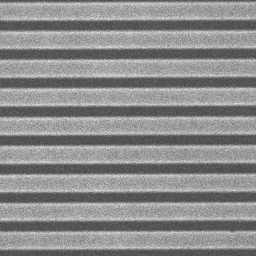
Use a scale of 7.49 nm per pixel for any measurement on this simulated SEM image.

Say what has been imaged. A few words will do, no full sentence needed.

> parallel lines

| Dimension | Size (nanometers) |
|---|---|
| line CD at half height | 132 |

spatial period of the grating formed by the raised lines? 214 nm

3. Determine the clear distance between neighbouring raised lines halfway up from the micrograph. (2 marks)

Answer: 81.4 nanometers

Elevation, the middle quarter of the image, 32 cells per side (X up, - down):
XXXXXXXXXXXXXXXXXXXXXXXXXXXXXXXX
XXXXXXXXXXXXXXXXXXXXXXXXXXXXXXXX
XXXXXXXXXXXXXXXXXXXXXXXXXXXXXXXX
--------------------------------
--------------------------------
--------------------------------
XXXXXXXXXXXXXXXXXXXXXXXXXXXXXXXX
XXXXXXXXXXXXXXXXXXXXXXXXXXXXXXXX
XXXXXXXXXXXXXXXXXXXXXXXXXXXXXXXX
XXXXXXXXXXXXXXXXXXXXXXXXXXXXXXXX
--------------------------------
--------------------------------
--------------------------------
XXXXXXXXXXXXXXXXXXXXXXXXXXXXXXXX
XXXXXXXXXXXXXXXXXXXXXXXXXXXXXXXX
XXXXXXXXXXXXXXXXXXXXXXXXXXXXXXXX
XXXXXXXXXXXXXXXXXXXXXXXXXXXXXXXX
XXXXXXXXXXXXXXXXXXXXXXXXXXXXXXXX
--------------------------------
--------------------------------
XXXXXXXXXXXXXXXXXXXXXXXXXXXXXXXX
XXXXXXXXXXXXXXXXXXXXXXXXXXXXXXXX
XXXXXXXXXXXXXXXXXXXXXXXXXXXXXXXX
XXXXXXXXXXXXXXXXXXXXXXXXXXXXXXXX
XXXXXXXXXXXXXXXXXXXXXXXXXXXXXXXX
--------------------------------
--------------------------------
--------------------------------
XXXXXXXXXXXXXXXXXXXXXXXXXXXXXXXX
XXXXXXXXXXXXXXXXXXXXXXXXXXXXXXXX
XXXXXXXXXXXXXXXXXXXXXXXXXXXXXXXX
XXXXXXXXXXXXXXXXXXXXXXXXXXXXXXXX